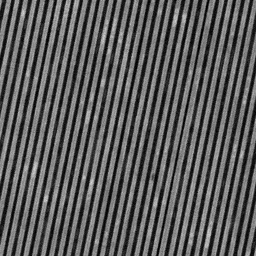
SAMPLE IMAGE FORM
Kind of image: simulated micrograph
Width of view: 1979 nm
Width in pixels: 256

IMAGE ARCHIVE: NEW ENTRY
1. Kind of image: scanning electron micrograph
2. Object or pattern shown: parallel lines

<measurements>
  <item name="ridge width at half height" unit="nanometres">34.1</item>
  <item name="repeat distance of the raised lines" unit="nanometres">64.6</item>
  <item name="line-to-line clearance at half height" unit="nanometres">33.2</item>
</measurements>